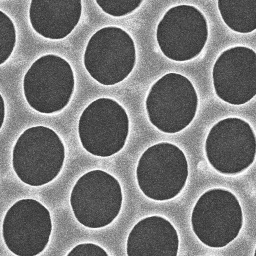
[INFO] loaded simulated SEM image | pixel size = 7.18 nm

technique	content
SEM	a regular array of holes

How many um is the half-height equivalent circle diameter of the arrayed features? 0.394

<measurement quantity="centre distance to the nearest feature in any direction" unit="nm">500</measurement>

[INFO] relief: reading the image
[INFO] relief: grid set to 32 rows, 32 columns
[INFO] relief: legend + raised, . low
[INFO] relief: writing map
++++......++......+++++++++.....
++++......+++....++++....++.....
.+++......++++++++++......++....
..++.....++++..+++++......+++...
..+++...++++....++++......++++++
..+++++++++......+++......++++++
.++++++++++......+++.....+++....
.++++...++.......+++++..+++.....
++++.....++......++++++++++.....
+++......++.....++++...++++.....
+++......++++.+++++.....+++.....
+++......++++++++++.....+++.....
+++......+++..++++.......+++...+
.+++....+++....+++.......+++++++
.+++++++++......++......++++++++
++++++++++......+++.....+++....+
+++....+++......++++..++++......
++......++......++++++++++......
++......++.....++++...++++......
++......++++..++++.....+++......
++......+++++++++......+++.....+
++.....++++..++++.......+++...++
+++...++++.....++......+++++++++
+++++++++......+++.....+++++++++
+++++++++......+++....+++....+++
++...++++......+++++++++......++
+.....+++......+++++++++......++
......++++....++++...+++......++
......+++++++++++.....++......++
......++++++++++......+++.....++
+.....++++..++++......++++..++++
++...++++....+++......++++++++++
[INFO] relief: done